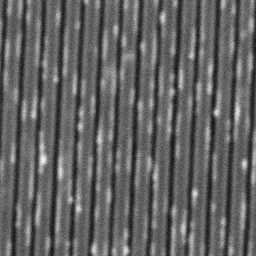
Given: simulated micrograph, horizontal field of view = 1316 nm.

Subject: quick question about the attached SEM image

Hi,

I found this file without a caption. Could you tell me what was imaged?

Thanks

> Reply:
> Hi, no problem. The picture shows parallel lines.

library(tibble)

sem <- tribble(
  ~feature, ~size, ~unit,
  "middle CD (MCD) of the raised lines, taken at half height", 0.068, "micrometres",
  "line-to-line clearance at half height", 29.5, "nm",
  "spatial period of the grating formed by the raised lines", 99.5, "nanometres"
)